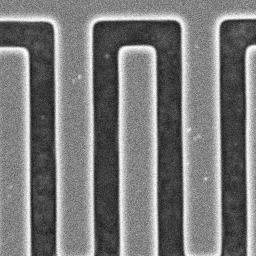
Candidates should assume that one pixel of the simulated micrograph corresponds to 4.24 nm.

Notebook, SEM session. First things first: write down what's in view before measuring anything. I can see groups of lines, slits or small figures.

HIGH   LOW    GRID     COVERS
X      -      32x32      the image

XXXXXXXXXXXXXXXXXXXXXXXXXXXXXXXX
XXXXXXXXXXXXXXXXXXXXXXXXXXXXXXXX
--XXXXXXXXXXX---------XXXXXX----
-------XXXXX-----------XXXX-----
-------XXXX------------XXXX-----
-------XXXX------------XXXX-----
XXX----XXXXX---XXXX----XXXX----X
XXXX---XXXXX---XXXXX---XXXX----X
XXXX---XXXXX---XXXXX---XXXX----X
XXXX---XXXXX---XXXXX---XXXX----X
XXXX---XXXXX---XXXXX---XXXX----X
XXXX---XXXXX---XXXXX---XXXX----X
XXXX---XXXXX---XXXXX---XXXX----X
XXXX---XXXXX---XXXXX---XXXX----X
XXXX---XXXXX---XXXXX---XXXX----X
XXXX---XXXXX---XXXXX---XXXX----X
XXXX---XXXXX---XXXXX---XXXX----X
XXXX---XXXXX---XXXXX---XXXX----X
XXXX---XXXXX---XXXXX---XXXX----X
XXXX---XXXXX---XXXXX---XXXX----X
XXXX---XXXXX---XXXXX---XXXX----X
XXXX---XXXXX---XXXXX---XXXXX---X
XXXX---XXXXX---XXXXX---XXXXX---X
XXXX---XXXXX---XXXXX---XXXXX---X
XXXX---XXXXX---XXXXX---XXXXX---X
XXXX---XXXXX---XXXXX---XXXXX---X
XXXX---XXXXX---XXXXX---XXXXX---X
XXXX---XXXXX---XXXXX---XXXXX---X
XXXX---XXXXX---XXXXX---XXXXX---X
XXXX---XXXXX---XXXXX---XXXXX---X
XXXX---XXXXX---XXXXX---XXXXX---X
XXXX---XXXXX---XXXXX---XXXXX---X